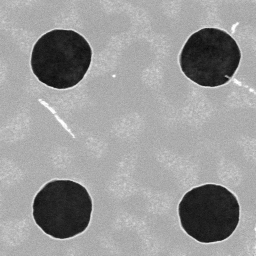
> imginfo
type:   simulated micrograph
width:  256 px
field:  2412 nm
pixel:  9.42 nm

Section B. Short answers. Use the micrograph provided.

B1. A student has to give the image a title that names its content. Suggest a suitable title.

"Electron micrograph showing holes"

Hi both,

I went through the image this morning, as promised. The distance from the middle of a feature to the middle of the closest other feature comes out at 1390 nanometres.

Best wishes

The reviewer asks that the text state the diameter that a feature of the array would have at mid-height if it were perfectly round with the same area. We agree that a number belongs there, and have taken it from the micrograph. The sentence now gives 562 nm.